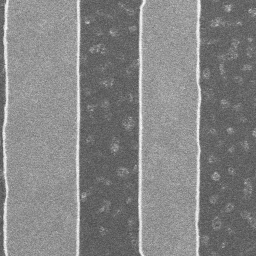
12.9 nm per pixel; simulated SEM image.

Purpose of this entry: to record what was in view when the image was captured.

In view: one or a few lines or trenches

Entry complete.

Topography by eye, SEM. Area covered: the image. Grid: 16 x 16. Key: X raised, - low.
XXXXX----XXX----
XXXXX----XXX----
XXXXX----XXX----
XXXXX----XXX----
XXXXX----XXX----
XXXXX----XXX----
XXXXX----XXX----
XXXXX----XXX----
XXXXX----XXX----
XXXXX----XXX----
XXXXX----XXX----
XXXXX----XXX----
XXXXX----XXX----
XXXXX----XXX----
XXXXX----XXX----
XXXXX----XXX----